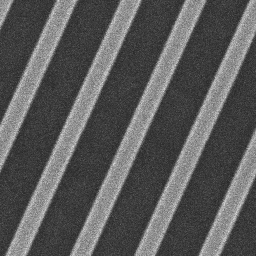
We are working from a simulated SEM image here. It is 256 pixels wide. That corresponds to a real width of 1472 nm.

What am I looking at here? parallel lines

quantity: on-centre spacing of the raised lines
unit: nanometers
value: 338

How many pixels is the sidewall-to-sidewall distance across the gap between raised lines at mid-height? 41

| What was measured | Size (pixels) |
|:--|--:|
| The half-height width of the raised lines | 17.5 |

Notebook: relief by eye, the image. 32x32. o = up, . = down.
o......oo......oo......oo......o
o......oo......oo......oo......o
......oo......ooo.....ooo.....oo
......oo......oo......oo......oo
.....ooo.....ooo.....ooo.....ooo
.....oo......oo......oo......oo.
....ooo.....ooo.....ooo.....ooo.
....oo......oo......oo......oo..
...ooo.....ooo.....ooo......oo..
...oo......oo......oo......oo...
..ooo......oo......oo......oo...
..oo......oo......ooo.....ooo...
..oo......oo......oo......oo....
.ooo.....ooo.....ooo.....ooo....
.oo......oo......oo......oo.....
ooo.....ooo.....ooo.....ooo.....
oo......oo......oo......oo......
oo.....ooo.....ooo.....ooo.....o
o......oo......oo......oo......o
o.....ooo.....ooo......oo......o
......oo......oo......oo......oo
......oo......oo......oo......oo
.....oo......ooo.....ooo.....ooo
.....oo......oo......oo......oo.
....ooo.....ooo.....ooo.....ooo.
....oo......oo......oo......oo..
...ooo.....ooo.....ooo.....ooo..
...oo......oo......oo......oo...
..ooo.....ooo.....ooo......oo...
..oo......oo......oo......oo....
.ooo......oo......oo......oo....
.oo......oo......ooo.....ooo....